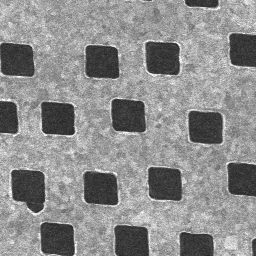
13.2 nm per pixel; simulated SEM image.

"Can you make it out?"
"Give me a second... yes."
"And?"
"a regular array of holes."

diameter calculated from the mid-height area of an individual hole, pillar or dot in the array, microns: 0.485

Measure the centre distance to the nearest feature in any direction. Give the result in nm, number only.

853